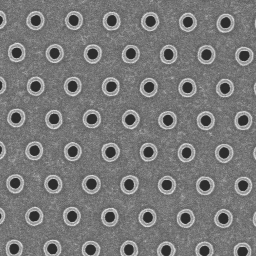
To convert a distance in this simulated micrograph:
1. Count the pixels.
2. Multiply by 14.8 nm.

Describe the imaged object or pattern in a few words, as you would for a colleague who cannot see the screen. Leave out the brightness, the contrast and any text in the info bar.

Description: a regular array of ring-shaped raised bodies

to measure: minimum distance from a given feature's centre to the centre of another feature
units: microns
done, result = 0.551